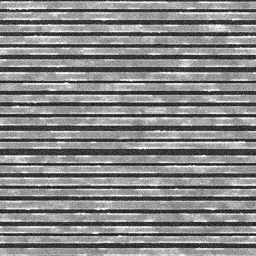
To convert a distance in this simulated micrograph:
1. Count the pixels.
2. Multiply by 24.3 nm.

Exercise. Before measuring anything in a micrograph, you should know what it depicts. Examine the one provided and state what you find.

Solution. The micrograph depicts parallel lines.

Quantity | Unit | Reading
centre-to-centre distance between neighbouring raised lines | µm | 0.284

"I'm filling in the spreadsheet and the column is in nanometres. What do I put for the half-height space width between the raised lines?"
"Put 106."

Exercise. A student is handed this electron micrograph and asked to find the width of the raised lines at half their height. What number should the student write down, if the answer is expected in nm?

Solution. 176